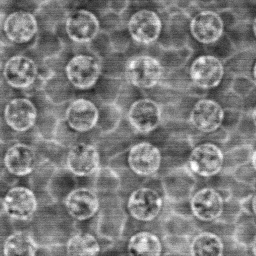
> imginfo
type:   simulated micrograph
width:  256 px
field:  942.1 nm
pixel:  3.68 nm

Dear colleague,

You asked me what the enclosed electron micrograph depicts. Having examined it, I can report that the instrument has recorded a regular array of raised bodies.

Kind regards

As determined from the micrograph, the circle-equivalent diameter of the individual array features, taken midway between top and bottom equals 30.8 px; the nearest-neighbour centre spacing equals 162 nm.